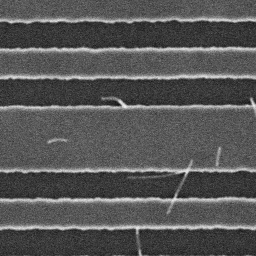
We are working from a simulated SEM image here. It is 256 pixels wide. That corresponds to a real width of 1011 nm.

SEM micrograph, lines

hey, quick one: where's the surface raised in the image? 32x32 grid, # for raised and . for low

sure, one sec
################################
################################
################################
................................
................................
................................
################################
################################
################################
################################
................................
................................
................................
################################
################################
################################
################################
################################
################################
################################
################################
......................##........
................................
................................
................................
################################
################################
################################
####.###########.#.#.#.##...####
................................
................................
................................